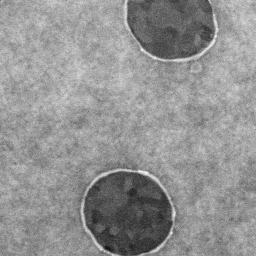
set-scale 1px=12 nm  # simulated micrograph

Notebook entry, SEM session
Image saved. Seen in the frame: raised bodies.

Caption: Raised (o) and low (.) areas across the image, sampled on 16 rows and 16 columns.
........ooooo...
........ooooo...
........ooooo...
.........ooo....
................
................
................
................
................
................
................
......oooo......
.....oooooo.....
.....oooooo.....
......ooooo.....
......oooo......